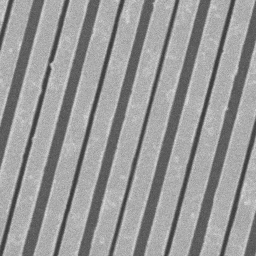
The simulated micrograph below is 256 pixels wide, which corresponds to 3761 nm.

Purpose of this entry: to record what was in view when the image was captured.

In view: parallel lines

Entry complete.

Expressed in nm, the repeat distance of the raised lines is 394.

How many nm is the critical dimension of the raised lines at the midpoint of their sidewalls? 258